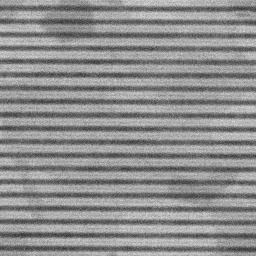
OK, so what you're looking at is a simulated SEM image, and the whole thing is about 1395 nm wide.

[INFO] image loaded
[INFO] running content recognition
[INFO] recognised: parallel lines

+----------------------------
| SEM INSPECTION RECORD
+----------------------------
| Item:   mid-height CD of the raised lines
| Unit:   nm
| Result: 29.3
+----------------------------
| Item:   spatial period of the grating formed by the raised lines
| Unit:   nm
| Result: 72.7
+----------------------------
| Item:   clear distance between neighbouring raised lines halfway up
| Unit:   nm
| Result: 43.6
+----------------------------